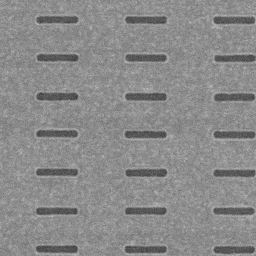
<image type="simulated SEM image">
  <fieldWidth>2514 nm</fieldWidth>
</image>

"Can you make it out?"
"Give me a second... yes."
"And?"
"a regular array of holes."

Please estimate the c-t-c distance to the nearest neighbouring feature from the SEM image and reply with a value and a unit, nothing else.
0.373 µm